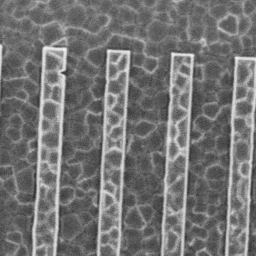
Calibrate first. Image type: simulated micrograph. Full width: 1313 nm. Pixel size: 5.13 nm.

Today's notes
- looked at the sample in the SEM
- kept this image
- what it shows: one or a few lines or trenches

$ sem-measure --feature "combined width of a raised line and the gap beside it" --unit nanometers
327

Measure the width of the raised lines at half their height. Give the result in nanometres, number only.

106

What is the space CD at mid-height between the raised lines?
220 nanometers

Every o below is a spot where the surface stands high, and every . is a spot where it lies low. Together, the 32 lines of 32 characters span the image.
................................
................................
................................
................................
................................
................................
.....ooo......oo................
.....ooo.....ooo......oo......oo
.....ooo.....ooo.....ooo.....ooo
.....ooo.....ooo.....ooo.....ooo
.....ooo.....ooo.....ooo.....ooo
.....ooo.....ooo.....ooo.....ooo
.....ooo.....ooo.....ooo.....ooo
.....ooo.....ooo.....ooo.....ooo
.....ooo.....ooo.....ooo.....ooo
.....ooo.....ooo.....ooo.....ooo
.....ooo.....ooo.....ooo.....ooo
.....ooo.....ooo.....ooo.....oo.
.....ooo.....ooo.....oo......ooo
.....ooo.....oo......oo......oo.
.....oo......oo......oo......oo.
.....oo......oo......oo......oo.
.....oo......oo......oo......oo.
.....oo......oo......oo......oo.
.....oo......oo......oo......oo.
.....oo......oo......oo......oo.
....ooo......oo......oo......oo.
....ooo.....ooo.....ooo.....ooo.
....ooo.....ooo.....ooo.....ooo.
....ooo.....ooo.....ooo.....ooo.
....ooo.....ooo.....ooo.....ooo.
....ooo.....ooo.....ooo.....ooo.